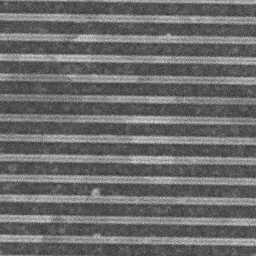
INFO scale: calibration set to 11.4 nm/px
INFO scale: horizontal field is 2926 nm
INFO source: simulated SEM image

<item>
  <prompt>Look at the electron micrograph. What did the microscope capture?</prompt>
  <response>parallel lines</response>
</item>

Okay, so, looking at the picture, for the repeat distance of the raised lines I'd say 230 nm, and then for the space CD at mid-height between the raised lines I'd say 14.6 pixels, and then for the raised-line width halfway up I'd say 58.6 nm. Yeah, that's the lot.